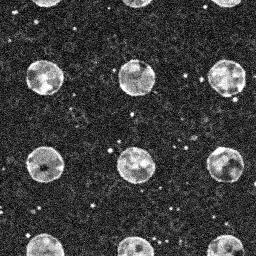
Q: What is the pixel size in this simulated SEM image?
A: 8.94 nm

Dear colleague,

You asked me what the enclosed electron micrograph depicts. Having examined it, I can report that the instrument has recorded raised bodies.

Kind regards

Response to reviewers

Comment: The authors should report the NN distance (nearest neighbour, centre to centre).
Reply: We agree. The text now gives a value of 779 nm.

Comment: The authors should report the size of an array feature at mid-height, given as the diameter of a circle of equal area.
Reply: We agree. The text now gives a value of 312 nm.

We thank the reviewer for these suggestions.